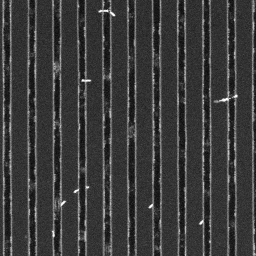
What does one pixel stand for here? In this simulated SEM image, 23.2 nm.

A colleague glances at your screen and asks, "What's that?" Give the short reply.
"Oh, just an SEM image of parallel lines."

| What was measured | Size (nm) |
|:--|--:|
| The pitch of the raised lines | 579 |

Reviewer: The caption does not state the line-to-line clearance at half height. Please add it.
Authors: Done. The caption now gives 0.412 microns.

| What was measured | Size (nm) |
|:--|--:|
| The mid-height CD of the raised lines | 171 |